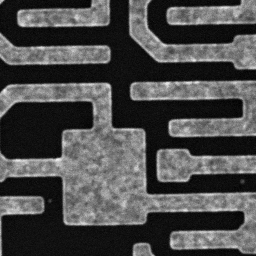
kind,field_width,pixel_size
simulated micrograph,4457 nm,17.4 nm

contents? wiring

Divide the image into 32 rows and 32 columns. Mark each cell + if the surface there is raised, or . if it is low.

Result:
...........+++..++............++
..++++++++++++..++...+++++++++++
..++++++++++++..++...+++++++++++
................+++.............
................+++...........++
+................++++........+++
++++++++++++++....++++++++++++++
++++++++++++++......++++++++++++
..............................++
................................
...........++....+++++++++++++++
++++++++++++++..++++++++++++++++
++++++++++++++................++
+...........++.................+
............++................++
............++.......+++++++++++
........++++++++++...+++++++++++
........++++++++++..............
........++++++++++..............
........++++++++++..++++........
++++++++++++++++++..++++++++++++
++++++++++++++++++..++++++++++++
........++++++++++..+++.........
........++++++++++..............
........++++++++++++++++++++++++
+++++...++++++++++++++++++++++++
+++++...+++++++++++...........++
........++++++++++.............+
..............................++
.....................+++++++++++
.................+...+++++++++++
.................++...........++